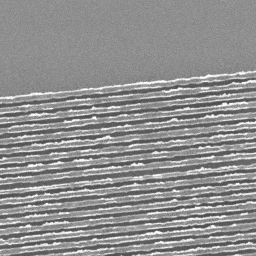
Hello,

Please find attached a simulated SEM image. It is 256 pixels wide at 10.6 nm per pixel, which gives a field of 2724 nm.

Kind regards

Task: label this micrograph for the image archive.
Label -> parallel lines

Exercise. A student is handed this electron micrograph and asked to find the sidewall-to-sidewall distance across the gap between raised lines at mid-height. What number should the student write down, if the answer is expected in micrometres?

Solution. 0.045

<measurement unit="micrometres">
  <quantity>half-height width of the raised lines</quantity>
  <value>0.0635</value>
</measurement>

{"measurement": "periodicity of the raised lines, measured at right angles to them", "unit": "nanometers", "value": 107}